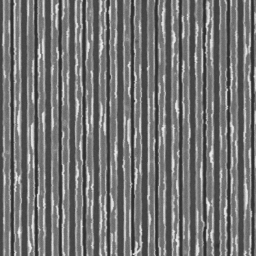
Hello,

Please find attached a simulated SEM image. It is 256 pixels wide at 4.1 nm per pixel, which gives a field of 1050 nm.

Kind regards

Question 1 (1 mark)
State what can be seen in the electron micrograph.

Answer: parallel lines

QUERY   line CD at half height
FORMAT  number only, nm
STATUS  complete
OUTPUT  31.3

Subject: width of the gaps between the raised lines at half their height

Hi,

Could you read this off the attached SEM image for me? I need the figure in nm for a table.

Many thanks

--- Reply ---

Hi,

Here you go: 17.4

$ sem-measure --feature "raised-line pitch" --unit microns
0.0493